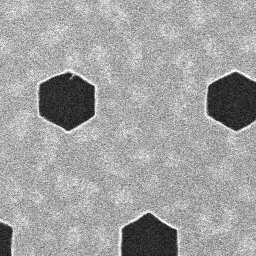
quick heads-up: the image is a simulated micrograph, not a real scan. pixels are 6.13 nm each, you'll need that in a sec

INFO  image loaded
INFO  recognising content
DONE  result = holes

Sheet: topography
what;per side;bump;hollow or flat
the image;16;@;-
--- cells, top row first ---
@@@@@@@@@@@@@@@@
@@@@@@@@@@@@@@@@
@@@@@@@@@@@@@@@@
@@@@@@@@@@@@@@@@
@@@@@@@@@@@@@@@@
@@----@@@@@@@---
@@----@@@@@@@---
@@@---@@@@@@@---
@@@@@@@@@@@@@@@@
@@@@@@@@@@@@@@@@
@@@@@@@@@@@@@@@@
@@@@@@@@@@@@@@@@
@@@@@@@@@@@@@@@@
@@@@@@@@@-@@@@@@
-@@@@@@@---@@@@@
-@@@@@@@---@@@@@